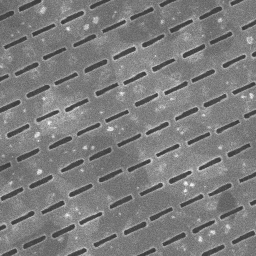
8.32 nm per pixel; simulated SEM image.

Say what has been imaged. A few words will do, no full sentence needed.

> a regular array of holes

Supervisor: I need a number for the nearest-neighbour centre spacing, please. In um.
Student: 0.219